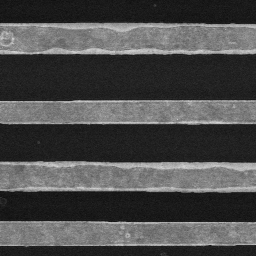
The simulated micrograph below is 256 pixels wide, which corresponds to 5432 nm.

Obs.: lines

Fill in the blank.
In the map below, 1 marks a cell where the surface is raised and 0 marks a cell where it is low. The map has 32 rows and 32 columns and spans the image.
00000000000000000000000000000000
00000000000000000000000000000000
00000000000000000000000000000000
11111111111111111111111111111111
11111111111111111111111111111111
11111111111111111111111111111111
11111111111011111101111111111111
00000000000000000000000000000000
00000000000000000000000000000000
00000000000000000000000000000000
00000000000000000000000000000000
00000000000000000000000000000000
00000000000000000000000000000000
11111111111111111111111111111111
11111111111111111111111111111111
00000000000000000000000000000000
00000000000000000000000000000000
00000000000000000000000000000000
00000000000000000000000000000000
00000000000000000000000000000000
11111111111111100000000000000000
11111111111111111111111111111111
11111111111111111111111111111111
11111111111111111111111111111111
00000000000000000000000000000000
00000000000000000000000000000000
00000000000000000000000000000000
00000000000000000000000000000000
11111111111111111111111111111111
11111111111111111111111111111111
11111111111111111111111111111111
00000000000000000000000000000000